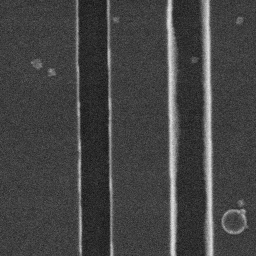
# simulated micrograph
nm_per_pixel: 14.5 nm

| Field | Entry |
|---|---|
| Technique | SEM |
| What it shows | lines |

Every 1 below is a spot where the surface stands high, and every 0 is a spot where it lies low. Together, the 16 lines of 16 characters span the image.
1111100111100111
1111100111100111
1111100111100111
1111100111100111
1111100111100111
1111100111100111
1111100111100111
1111100111100111
1111100111100111
1111100111100111
1111100111100111
1111100111100111
1111100111100111
1111100111100111
1111100111100111
1111100111100111